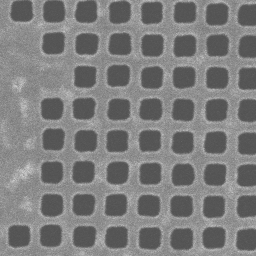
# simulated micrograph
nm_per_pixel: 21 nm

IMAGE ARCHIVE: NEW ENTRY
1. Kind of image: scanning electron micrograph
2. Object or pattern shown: a regular array of holes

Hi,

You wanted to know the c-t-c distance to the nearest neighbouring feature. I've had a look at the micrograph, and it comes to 666 nanometres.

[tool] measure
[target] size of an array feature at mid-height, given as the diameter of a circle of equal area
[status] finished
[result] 515 nanometres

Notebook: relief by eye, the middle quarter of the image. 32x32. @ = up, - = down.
@@@@---@@@@-----@@@@@@@@@@@@@@@@
@@------@@@------@@@-----@@-----
@@------@@@------@@------@@-----
@@------@@@------@@------@@-----
@@------@@@-----@@@------@@-----
@@@----@@@@-----@@@-----@@@-----
@@@@@@@@@@@@@@@@@@@@@@@@@@@@@@@@
@@@@@@@@@@@@@@@@@@@@@@@@@@@@@@@@
@@@@-@-@@@@@@--@@@@@@@-@@@@@@@@@
@@------@@@------@@-----@@@-----
@@------@@@------@@------@@-----
@@------@@@------@@------@@-----
@@------@@@------@@------@@-----
@@@----@@@@-----@@@-----@@@-----
@@@@@@@@@@@@@@@@@@@@@@@@@@@@@@@@
@@@@@@@@@@@@@@@@@@@@@@@@@@@@@@@@
@@@@---@@@@@---@@@@@---@@@@@@@@@
@@@-----@@@-----@@@-----@@@@----
@@------@@------@@@-----@@@-----
@@------@@@-----@@@-----@@@-----
@@------@@------@@@-----@@@-----
@@@-----@@@-----@@@-----@@@-----
@@@@@@@@@@@@@@@@@@@@@@@@@@@@---@
@@@@@@@@@@@@@@@@@@@@@@@@@@@@@@@@
@@@----@@@@@----@@@@@@@@@@@@@@@@
@@------@@@-----@@@-----@@@-----
@@------@@@-----@@@-----@@@-----
@@------@@@-----@@@-----@@@-----
@@------@@@-----@@@------@@-----
@@@----@@@@-----@@@-----@@@-----
@@@@@@@@@@@@@@@@@@@@@@@@@@@@---@
@@@@@@@@@@@@@@@@@@@@@@@@@@@@@@@@